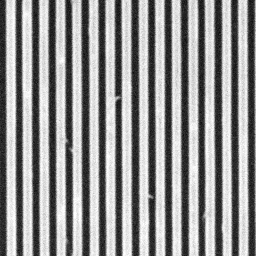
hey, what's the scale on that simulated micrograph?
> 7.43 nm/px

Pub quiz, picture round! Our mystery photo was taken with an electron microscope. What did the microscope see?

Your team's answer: parallel lines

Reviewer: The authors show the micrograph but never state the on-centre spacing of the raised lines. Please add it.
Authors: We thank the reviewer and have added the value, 123 nm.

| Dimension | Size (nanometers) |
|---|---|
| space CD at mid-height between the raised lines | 63.2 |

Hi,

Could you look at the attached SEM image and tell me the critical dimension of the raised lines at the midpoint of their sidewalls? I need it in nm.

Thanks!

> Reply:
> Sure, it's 64.1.